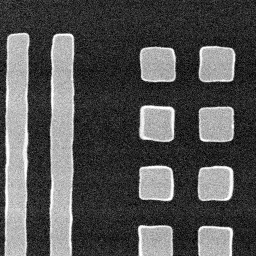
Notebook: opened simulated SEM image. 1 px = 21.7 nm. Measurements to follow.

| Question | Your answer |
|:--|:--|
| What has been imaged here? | groups of lines, slits or small figures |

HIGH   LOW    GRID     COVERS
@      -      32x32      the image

--------------------------------
--------------------------------
--------------------------------
--------------------------------
-@@----@@-----------------------
-@@@---@@-----------------------
-@@----@@---------@@@@---@@@@---
-@@----@@---------@@@@---@@@@---
-@@----@@---------@@@@---@@@@---
-@@----@@---------@@@@---@@@@---
-@@----@@-----------------------
-@@----@@-----------------------
-@@----@@-----------------------
-@@----@@---------@@@----@@@@---
-@@----@@---------@@@@---@@@@---
-@@---@@@---------@@@@---@@@@---
-@@---@@@---------@@@@---@@@@---
-@@---@@@----------@@-----@@@---
-@@---@@@-----------------------
-@@---@@@-----------------------
-@@----@@-----------------------
-@@----@@---------@@@----@@@@---
-@@----@@---------@@@@---@@@@---
-@@----@@--------@@@@@---@@@@---
-@@----@@---------@@@----@@@@---
-@@---@@@-----------------------
-@@---@@@-----------------------
-@@---@@@-----------------------
-@@---@@@---------@@@----@@-----
-@@---@@@--------@@@@@---@@@@---
-@@---@@@---------@@@@---@@@@---
-@@---@@@---------@@@@---@@@@---